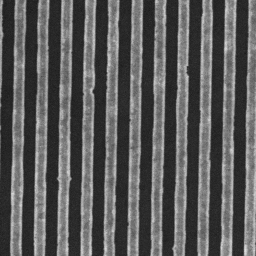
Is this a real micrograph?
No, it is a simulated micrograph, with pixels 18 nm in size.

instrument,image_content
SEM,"parallel lines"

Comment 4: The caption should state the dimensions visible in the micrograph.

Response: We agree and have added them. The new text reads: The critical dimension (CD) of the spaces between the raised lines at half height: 261 nanometers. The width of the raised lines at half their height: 162 nm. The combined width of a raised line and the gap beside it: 420 nanometres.